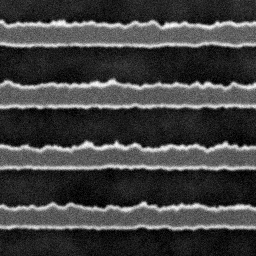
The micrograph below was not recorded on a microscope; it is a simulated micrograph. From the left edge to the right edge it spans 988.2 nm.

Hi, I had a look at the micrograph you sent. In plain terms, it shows lines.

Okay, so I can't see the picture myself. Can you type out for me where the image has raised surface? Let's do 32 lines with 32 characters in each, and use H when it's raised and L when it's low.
LLLLLLLLLLLLLLLLLLLLLLLLLLLLLLLL
LLLLLLLLLLLLLLLLLLLLLLLLLLLLLLLL
LLLLLLLLLLLLLLLLLLLLLLLLLLLLLLLL
HHHHHHHHHHHHHHHHHHHHHHHHHHHHHHHH
HHHHHHHHHHHHHHHHHHHHHHHHHHHHHHHH
HHHHHHHHHHHHHHHHHHHHHHHHHHLHHHHH
LLLLLLLLLLLLLLLLLLLLLLLLLLLLLLLL
LLLLLLLLLLLLLLLLLLLLLLLLLLLLLLLL
LLLLLLLLLLLLLLLLLLLLLLLLLLLLLLLL
LLLLLLLLLLLLLLLLLLLLLLLLLLLLLLLL
HHLLLLHLLLLLLHHLLLLLLLLLHLLLLHLL
HHHHHHHHHHHHHHHHHHHHHHHHHHHHHHHH
HHHHHHHHHHHHHHHHHHHHHHHHHHHHHHHH
HLLLLHLLLLHLLLHHLLLLLLLLHLLLLLLL
LLLLLLLLLLLLLLLLLLLLLLLLLLLLLLLL
LLLLLLLLLLLLLLLLLLLLLLLLLLLLLLLL
LLLLLLLLLLLLLLLLLLLLLLLLLLLLLLLL
LLLLLLLLLLLLLLLLLLLLLLLLLLLLLLLL
HHHHLHHHLHHHHHHHHHLLHHHHHHHHHHHH
HHHHHHHHHHHHHHHHHHHHHHHHHHHHHHHH
HHHHHHHHHHHHHHHHHHHHHHHHHHHHHHHH
LLLLLLLLLLLLLLLLLLLLLLLLLLLLLLLL
LLLLLLLLLLLLLLLLLLLLLLLLLLLLLLLL
LLLLLLLLLLLLLLLLLLLLLLLLLLLLLLLL
LLLLLLLLLLLLLLLLLLLLLLLLLLLLLLLL
LLLLLLHLLLLLLLLLLLLLLLLLLLLLLLLL
HHHHHHHHHHHHHHHHHHHHHHHHHHHHHHHH
HHHHHHHHHHHHHHHHHHHHHHHHHHHHHHHH
LHLLHHHHLLHHHHHHHLHHLHHHHLLLHHHH
LLLLLLLLLLLLLLLLLLLLLLLLLLLLLLLL
LLLLLLLLLLLLLLLLLLLLLLLLLLLLLLLL
LLLLLLLLLLLLLLLLLLLLLLLLLLLLLLLL